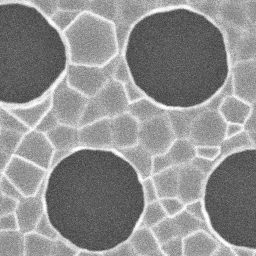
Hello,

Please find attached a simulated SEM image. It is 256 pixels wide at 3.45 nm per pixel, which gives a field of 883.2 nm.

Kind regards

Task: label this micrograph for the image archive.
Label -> holes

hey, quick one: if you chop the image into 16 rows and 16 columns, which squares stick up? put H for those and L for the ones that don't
LLHHHHHHHHHHHHHH
LLLHHHHHHLLLLHHH
LLLLHHHHLLLLLLHH
LLLLHHHHLLLLLLHH
LLLLHHHHLLLLLLHH
LLLHHHHHHLLLLLHH
HHHHHHHHHHLLHHHH
HHHHHHHHHHHHHHHH
HHHHHHHHHHHHHHHH
HHHHHLLHHHHHHHHL
HHHLLLLLHHHHHLLL
HHHLLLLLLHHHHLLL
HHHLLLLLLHHHHLLL
HHHLLLLLLHHHHLLL
HHHHLLLLHHHHHHLL
HHHHHLLHHHHHHHHH